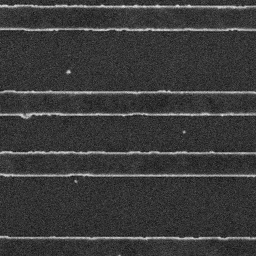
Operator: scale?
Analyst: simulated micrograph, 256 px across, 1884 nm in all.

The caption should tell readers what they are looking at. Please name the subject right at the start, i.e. lines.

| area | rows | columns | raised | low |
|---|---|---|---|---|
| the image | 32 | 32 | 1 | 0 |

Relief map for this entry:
00000000000000000000000000000000
11111111111111111111111111111111
11111111111111111111111111111111
11111111111111111111111111111111
00000000000000000000000000000000
00000000000000000000000000000000
00000000000000000000000000000000
00000000000000000000000000000000
00000000000000000000000000000000
00000000000000000000000000000000
00000000000000000000000000000000
11001010000000000001100000000000
11111111111111111111111111111111
11111111111111111111111111111111
00000000000000000000000000000000
00000000000000000000000000000000
00000000000000000000000000000000
00000000000000000000000000000000
00000000000000000000000000000000
11111111111111111111111111111111
11111111111111111111111111111111
11111111111111111111111111111111
00000000000000000000000000000000
00000000000000000000000000000000
00000000000000000000000000000000
00000000000000000000000000000000
00000000000000000000000000000000
00000000000000000000000000000000
00000000000000000000000000000000
00000000000000000000000000000000
11111111111111111111111111111111
11111111111111111111111111111111